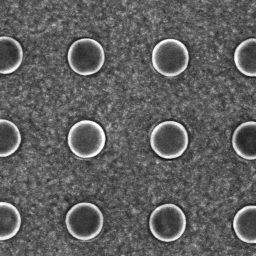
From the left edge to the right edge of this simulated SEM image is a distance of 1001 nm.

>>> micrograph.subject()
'raised bodies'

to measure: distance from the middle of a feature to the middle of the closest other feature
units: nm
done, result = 321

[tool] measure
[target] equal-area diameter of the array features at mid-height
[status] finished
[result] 140 nm